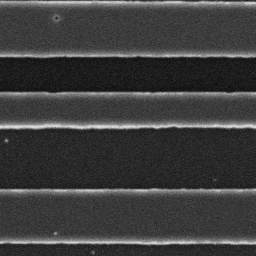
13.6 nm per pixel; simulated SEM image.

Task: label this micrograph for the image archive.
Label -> lines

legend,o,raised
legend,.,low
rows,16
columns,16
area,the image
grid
oooooooooooooooo
oooooooooooooooo
oooooooooooooooo
oooooooooooooooo
................
................
oooooooooooooooo
oooooooooooooooo
................
................
................
................
oooooooooooooooo
oooooooooooooooo
oooooooooooooooo
................